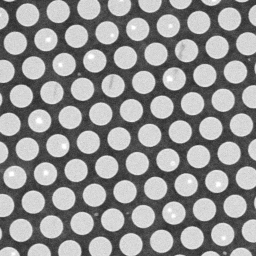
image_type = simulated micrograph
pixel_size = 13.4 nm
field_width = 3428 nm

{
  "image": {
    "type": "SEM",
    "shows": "an array of small figures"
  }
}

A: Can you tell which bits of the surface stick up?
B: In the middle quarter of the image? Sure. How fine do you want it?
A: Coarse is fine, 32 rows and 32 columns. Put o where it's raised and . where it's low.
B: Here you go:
ooo..ooooo....ooo...............
oo....ooo.................ooo...
oo................oooo...ooooo..
..........oooo...ooooo...ooooo..
...oooo...ooooo..oooooo..ooooo..
..ooooo...ooooo..oooooo..ooooo..
..ooooo...ooooo...oooo.....o....
..ooooo...oooo.................o
...ooo.................ooo....oo
...............ooo....ooooo..ooo
.......oooo...ooooo...ooooo..ooo
oooo...ooooo..ooooo...ooooo...oo
oooo...ooooo..oooooo..ooooo....o
oooo...ooooo...oooo.............
oooo...oooo.................oo..
ooo.................ooo....oooo.
............ooo....ooooo..oooooo
....oooo...ooooo...ooooo..oooooo
o..oooooo..ooooo...ooooo...oooo.
o..oooooo..ooooo...ooooo....oo..
o..oooooo...oooo....oo..........
o...oooo.................oo....o
.................ooo....oooo...o
.........ooo....ooooo..oooooo..o
.oooo...ooooo...ooooo..oooooo..o
oooooo..ooooo...ooooo...oooo....
oooooo..ooooo...ooooo....oo.....
oooooo...oooo....oo...........o.
.oooo.................oo....oooo
..............ooo....oooo...oooo
......ooo....ooooo..oooooo..oooo
oo...ooooo...ooooo..oooooo..oooo